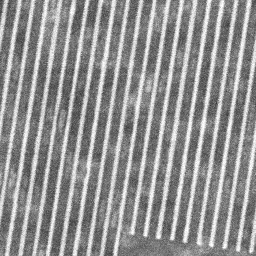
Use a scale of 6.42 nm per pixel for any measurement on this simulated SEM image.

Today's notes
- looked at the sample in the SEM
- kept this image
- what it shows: parallel lines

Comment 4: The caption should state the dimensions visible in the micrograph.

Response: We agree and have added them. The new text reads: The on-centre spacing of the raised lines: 85.8 nm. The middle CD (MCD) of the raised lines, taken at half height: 0.0182 micrometres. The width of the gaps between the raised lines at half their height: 65.8 nanometres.